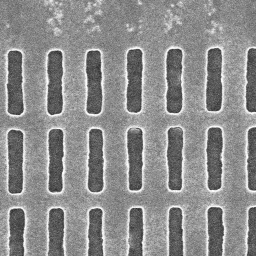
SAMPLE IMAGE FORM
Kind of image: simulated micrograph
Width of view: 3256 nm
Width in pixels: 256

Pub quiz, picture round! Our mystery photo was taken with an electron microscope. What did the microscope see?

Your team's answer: a regular array of holes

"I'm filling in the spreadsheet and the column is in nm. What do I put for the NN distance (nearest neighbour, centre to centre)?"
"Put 505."